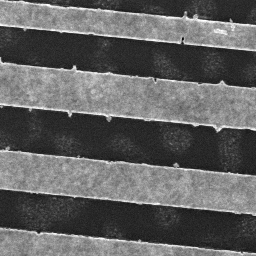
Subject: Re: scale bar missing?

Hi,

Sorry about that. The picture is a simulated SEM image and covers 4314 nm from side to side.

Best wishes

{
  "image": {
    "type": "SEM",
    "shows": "one or a few lines or trenches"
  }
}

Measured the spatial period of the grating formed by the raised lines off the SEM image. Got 1320 nm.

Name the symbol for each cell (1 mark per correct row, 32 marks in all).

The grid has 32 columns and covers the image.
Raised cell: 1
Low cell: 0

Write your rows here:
11110000000000000000000000000000
11111111111111100000000000000000
11111111111111111111111110000000
00011111111111111111111111111111
00000000000000111111111111111111
00000000000000000000000011111111
00000000000000000000000000000000
00000000000000000000000000000000
11111100000000000000000000000000
11111111111111110000000000000000
11111111111111111111111111010000
11111111111111111111111111111111
11111111111111111111111111111111
00001111111111111111111111111111
00000000000000111111111111111111
00000000000000000000000011111111
00000000000000000000000000000000
00000000000000000000000000000000
00000000000000000000000000000000
11111110000000000000000000000000
11111111111111111000000000000000
11111111111111111111111111100000
11111111111111111111111111111111
11111111111111111111111111111111
00000000011111111111111111111111
00000000000000000001111111111111
00000000000000000000000000000111
00000000000000000000000000000000
00000000000000000000000000000000
11111111110000000000000000000000
11111111111111111110000000000000
11111111111111111111111111111000